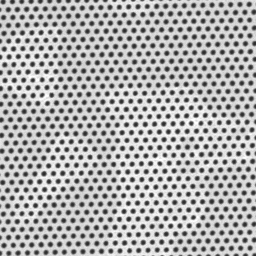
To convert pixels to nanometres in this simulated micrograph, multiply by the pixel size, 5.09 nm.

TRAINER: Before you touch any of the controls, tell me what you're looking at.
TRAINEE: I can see a regular array of holes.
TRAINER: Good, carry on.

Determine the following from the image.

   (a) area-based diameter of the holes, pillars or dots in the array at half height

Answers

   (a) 27.6 nanometers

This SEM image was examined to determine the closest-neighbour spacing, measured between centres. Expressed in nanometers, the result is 44.9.